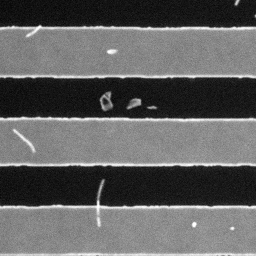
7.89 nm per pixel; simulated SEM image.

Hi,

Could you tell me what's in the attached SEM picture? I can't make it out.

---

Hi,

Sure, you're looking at lines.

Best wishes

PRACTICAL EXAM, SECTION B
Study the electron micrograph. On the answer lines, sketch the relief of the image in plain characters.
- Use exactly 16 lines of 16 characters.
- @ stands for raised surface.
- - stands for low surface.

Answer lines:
----------------
----------------
@@@@@@@@@@@@@@@@
@@@@@@@@@@@@@@@@
@@@@@@@@@@@@@@@@
----------------
----------------
@@@@@@@@@@@@@@@@
@@@@@@@@@@@@@@@@
@@@@@@@@@@@@@@@@
----------------
----------------
----------------
@@@@@@@@@@@@@@@@
@@@@@@@@@@@@@@@@
@@@@@@@@@@@@@@@@